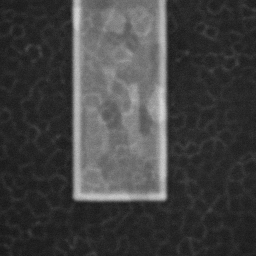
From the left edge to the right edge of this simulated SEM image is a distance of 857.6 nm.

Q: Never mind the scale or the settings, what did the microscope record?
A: one or a few lines or trenches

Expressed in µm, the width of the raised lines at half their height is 0.286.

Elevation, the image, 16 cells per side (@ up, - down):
-----@@@@@------
-----@@@@@------
-----@@@@@------
-----@@@@@------
-----@@@@@------
-----@@@@@------
-----@@@@@------
-----@@@@@------
-----@@@@@------
-----@@@@@------
-----@@@@@------
-----@@@@@------
----------------
----------------
----------------
----------------